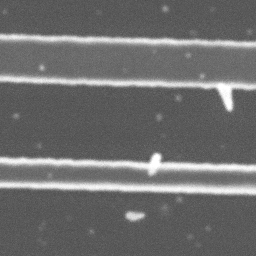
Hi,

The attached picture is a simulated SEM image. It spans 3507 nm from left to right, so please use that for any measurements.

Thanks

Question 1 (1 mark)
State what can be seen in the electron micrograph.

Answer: lines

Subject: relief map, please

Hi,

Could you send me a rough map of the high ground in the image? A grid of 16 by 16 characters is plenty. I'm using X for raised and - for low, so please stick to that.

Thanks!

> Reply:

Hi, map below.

----------------
----------------
XXXXXXXXX-------
XXXXXXXXXXXXXXXX
XXXXXXXXXXXXXXXX
-------------XXX
----------------
----------------
----------------
----------------
XXXXXXXXXXXXXXXX
XXXXXXXXXXXXXXXX
----------------
----------------
----------------
----------------